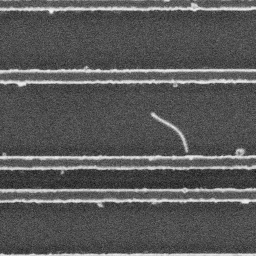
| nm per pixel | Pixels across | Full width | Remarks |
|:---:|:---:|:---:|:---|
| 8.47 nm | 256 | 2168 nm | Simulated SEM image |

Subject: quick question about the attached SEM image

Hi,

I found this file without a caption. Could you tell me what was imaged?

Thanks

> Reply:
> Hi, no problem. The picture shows lines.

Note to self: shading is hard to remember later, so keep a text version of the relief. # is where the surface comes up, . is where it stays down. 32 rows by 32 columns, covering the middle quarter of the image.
................................
................................
################################
################################
########.########....#.......#..
................................
................................
................................
................................
................................
................................
................................
................................
................................
................................
................................
................................
................................
................................
................................
................................
................................
................................
################################
################################
################################
................................
................................
................................
................................
................................
################################